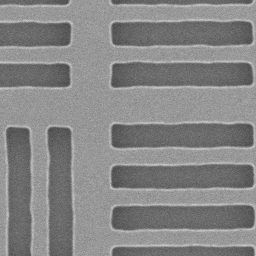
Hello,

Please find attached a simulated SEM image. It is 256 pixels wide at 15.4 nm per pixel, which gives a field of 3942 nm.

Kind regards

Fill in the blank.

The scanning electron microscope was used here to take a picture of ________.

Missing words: groups of lines, slits or small figures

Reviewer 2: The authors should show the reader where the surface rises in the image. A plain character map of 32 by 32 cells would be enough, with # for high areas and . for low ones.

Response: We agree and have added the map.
........######.................#
################################
#######################....##.##
.........#####..................
.........#####..................
.........#####.................#
################################
################################
.........#####..................
.........#####..................
.........#####.................#
################################
################################
################################
################################
#################..............#
#...##...#####..................
#...##...#####..................
#...##...######.............#..#
#...##...#######################
#...##...#################...###
#...##...#####..................
#...##...#####..................
#...##...#####.................#
#...##...#######################
#...##...####################..#
#...##...#####..................
#...##...#####..................
#...##...#####.................#
#...##...#######################
#...##...#######################
#...##...#####..................